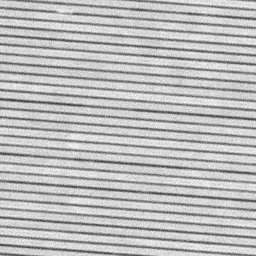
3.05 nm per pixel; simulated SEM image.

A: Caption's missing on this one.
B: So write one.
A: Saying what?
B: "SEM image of parallel lines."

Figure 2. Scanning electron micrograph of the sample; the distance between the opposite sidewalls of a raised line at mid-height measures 19 nm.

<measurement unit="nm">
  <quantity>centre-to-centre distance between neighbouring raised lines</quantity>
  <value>27.7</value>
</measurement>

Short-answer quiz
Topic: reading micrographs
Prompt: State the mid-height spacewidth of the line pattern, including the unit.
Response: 8 nm